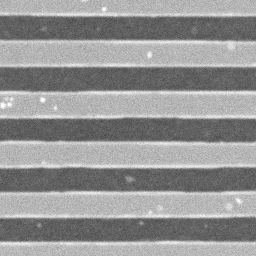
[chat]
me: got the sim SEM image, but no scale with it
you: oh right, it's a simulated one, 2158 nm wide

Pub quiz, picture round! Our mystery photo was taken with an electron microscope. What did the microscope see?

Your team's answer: lines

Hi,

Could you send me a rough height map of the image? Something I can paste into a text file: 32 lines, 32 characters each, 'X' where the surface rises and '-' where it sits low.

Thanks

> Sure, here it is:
XXXXXXXXXXXXXXXXXXXXXXXXXXXXXXXX
XXXXXXXXXXXXXXXXXXXXXXXXXXXXXXXX
--------------------------------
--------------------------------
--------------------------------
XXXXXXXXXXXXXXXXXXXXXXXXXXXXXXXX
XXXXXXXXXXXXXXXXXXXXXXXXXXXXXXXX
XXXXXXXXXXXXXXXXXXXXXXXXXXXXXXXX
--------------------------------
--------------------------------
--------------------------------
XXXX------XXXXXXXXXXXXXXXXXXXXXX
XXXXXXXXXXXXXXXXXXXXXXXXXXXXXXXX
XXXXXXXXXXXXXXXXXXXXXXXXXXXXXXXX
XXXXXXXXXXXXXXXXXXXXXXXXXXXXXXXX
--------------------------------
--------------------------------
--------------------------------
XXXXXXXXXXXXXXXXXXXXXXXXXXXXXXXX
XXXXXXXXXXXXXXXXXXXXXXXXXXXXXXXX
XXXXXXXXXXXXXXXXXXXXXXXXXXXXXXXX
--------------------------------
--------------------------------
--------------------------------
XXXXXXXXXXXXXXXXXXXXXXXXXXXXXXXX
XXXXXXXXXXXXXXXXXXXXXXXXXXXXXXXX
XXXXXXXXXXXXXXXXXXXXXXXXXXXXXXXX
--------------------------------
--------------------------------
--------------------------------
XXXXXXXXXXXXXXXXXXXXXXXXXXXXXXXX
XXXXXXXXXXXXXXXXXXXXXXXXXXXXXXXX